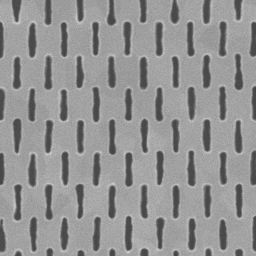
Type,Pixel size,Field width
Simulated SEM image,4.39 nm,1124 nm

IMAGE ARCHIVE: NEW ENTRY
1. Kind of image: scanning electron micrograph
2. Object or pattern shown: a regular array of holes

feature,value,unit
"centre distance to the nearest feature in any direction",137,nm